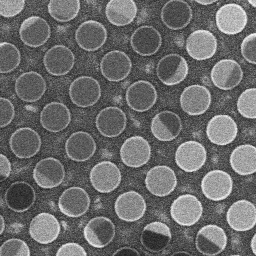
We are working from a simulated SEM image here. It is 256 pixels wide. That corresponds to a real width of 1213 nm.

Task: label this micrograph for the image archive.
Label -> a regular array of raised bodies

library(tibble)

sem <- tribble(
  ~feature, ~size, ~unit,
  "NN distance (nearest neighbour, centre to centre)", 38.8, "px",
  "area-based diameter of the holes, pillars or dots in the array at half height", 141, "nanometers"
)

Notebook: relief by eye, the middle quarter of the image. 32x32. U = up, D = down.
UUDDDDDDDUUUUUUUUDDDDDDUUUUUUUUD
UUDDDDDDDUUUUUUUUDDDDDDUUUUUUUUD
DDDDDDDDDDUUUUUUDDDDDDDUUUUUUUUD
DDDDUUUDDDDUUUUDDDDDDDDDUUUUUUDD
DDUUUUUUDDDDDDDDDDUUDDDDDUUUUDDD
DDUUUUUUUDDDDDDDDUUUUUDDDDDDDDDD
DUUUUUUUUDDDDDDDUUUUUUUDDDDDDDUU
DDUUUUUUUDDDDDDDUUUUUUUDDDDDDDUU
DDUUUUUUUDDDDDDDUUUUUUUDDDDDDUUU
DDUUUUUUDDDDDDDDUUUUUUUDDDDDDUUU
DDDDUUDDDDDDDDDDDUUUUUDDDDDDDUUU
UDDDDDDDDDUUUUDDDDUUUDDDDDDDDDUU
UDDDDDDDDUUUUUUDDDDDDDDDUUUUDDDD
UDDDDDDDUUUUUUUDDDDDDDDUUUUUUDDD
UDDDDDDDUUUUUUUDDDDDDDUUUUUUUDDD
UDDDDDDDUUUUUUUDDDDDDDUUUUUUUDDD
DDDDDDDDDUUUUUUDDDDDDDUUUUUUUDDD
DDUUUUDDDDUUUUDDDDDDDDUUUUUUUDDD
DUUUUUUDDDDDDDDDDUUDDDDUUUUDDDDD
DUUUUUUUDDDDDDDUUUUUUDDDDDDDDDDD
UUUUUUUUDDDDDDDUUUUUUDDDDDDDDUUU
DUUUUUUUDDDDDDUUUUUUUDDDDDDDUUUU
DUUUUUUDDDDDDDUUUUUUUDDDDDDDUUUU
DDUUUUDDDDDDDDUUUUUUUDDDDDDDUUUU
DDDDDDDDDDUDDDDUUUUUUDDDDDDDUUUU
DDDDDDDDUUUUUDDDUUUDDDDDDDDDDUUU
DDDDDDDUUUUUUUDDDDDDDDUUUUUDDDDU
DDDDDDDUUUUUUUDDDDDDDUUUUUUUDDDD
DDDDDDDUUUUUUUDDDDDDDUUUUUUUDDDD
DDDDDDDUUUUUUUDDDDDDUUUUUUUUDDDD
DDDDDDDUUUUUUDDDDDDDDUUUUUUUDDDD
DUUUUDDDUUUUDDDDDDDDDUUUUUUDDDDD